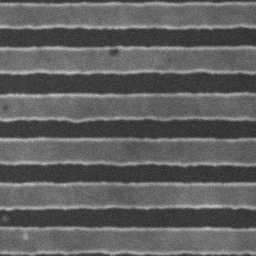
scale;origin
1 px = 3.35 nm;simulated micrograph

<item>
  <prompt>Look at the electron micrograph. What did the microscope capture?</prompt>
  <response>lines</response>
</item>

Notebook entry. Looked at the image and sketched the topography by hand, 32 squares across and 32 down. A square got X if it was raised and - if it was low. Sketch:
XXXXXX-XXXXXXXXXXXXXXXXXXXXXXXXX
XXXXXXXXXXXXXXXXXXXXXXXXXXXXXXXX
XXXXXXXXXXXXXXXXXXXXXXXXXXXXXXXX
--X-X------XXXXX-----XXX--X-----
--------------------------------
--------------------------------
XXXXXXXXXXXXXXXXXXXXXXXXXXXXXXXX
XXXXXXXXXXXXXXXXXXXXXXXXXXXXXXXX
XXXXXXXXXXXXXXXXXXXXXXXXXXXXXXXX
--------------------------------
--------------------------------
--------------------------------
XXXXXXXXXXXXXXXXXXXXXXXXXXXXXXXX
XXXXXXXXXXXXXXXXXXXXXXXXXXXXXXXX
XXXXXXXXXXXXXXXXXXXXXXXXXXXXXXXX
--------------------------------
--------------------------------
XXXXXXXXXXXXXXXXXXXXXXXXXXXXXXXX
XXXXXXXXXXXXXXXXXXXXXXXXXXXXXXXX
XXXXXXXXXXXXXXXXXXXXXXXXXXXXXXXX
-X---X--------XXXX--XXXXXXXXXXXX
--------------------------------
--------------------------------
XXXXXXXXXXXXXXXXXXXXXXXXXXXXXXXX
XXXXXXXXXXXXXXXXXXXXXXXXXXXXXXXX
XXXXXXXXXXXXXXXXXXXXXXXXXXXXXXXX
--------------------------------
--------------------------------
XXXX-XXXXXX--XX----------X------
XXXXXXXXXXXXXXXXXXXXXXXXXXXXXXXX
XXXXXXXXXXXXXXXXXXXXXXXXXXXXXXXX
XXXXXXXXXXXXXXXXXXXXXXXXXXXXXXXX